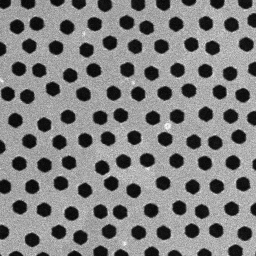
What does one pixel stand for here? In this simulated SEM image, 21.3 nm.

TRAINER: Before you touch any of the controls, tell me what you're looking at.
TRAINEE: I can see a regular array of holes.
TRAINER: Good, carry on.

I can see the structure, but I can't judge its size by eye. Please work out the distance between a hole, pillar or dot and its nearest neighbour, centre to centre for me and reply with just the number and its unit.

23 pixels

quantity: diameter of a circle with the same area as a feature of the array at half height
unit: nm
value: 318